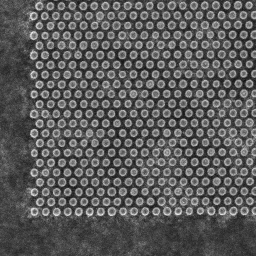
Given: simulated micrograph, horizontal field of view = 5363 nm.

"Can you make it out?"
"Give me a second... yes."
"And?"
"a regular array of raised bodies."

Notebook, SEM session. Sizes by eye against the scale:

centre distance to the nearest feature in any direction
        228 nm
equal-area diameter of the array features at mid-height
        151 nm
